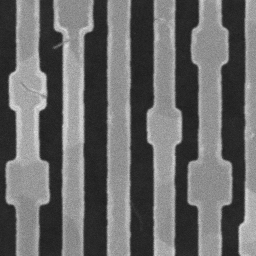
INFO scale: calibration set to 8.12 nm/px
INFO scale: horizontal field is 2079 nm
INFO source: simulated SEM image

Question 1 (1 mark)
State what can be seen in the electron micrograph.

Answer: wiring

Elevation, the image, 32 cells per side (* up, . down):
..*....*****..**...***.........*
..***.........**...***....**...*
..***.........**...***...***...*
..***.........**...***...***...*
..***..............***..****...*
..***...*..........***..****...*
..***...*.....**...***..****...*
..***...**....**...***..****...*
..***...**....**...***...***...*
.*****..**....**...***...***...*
.*****..**....**...***...***....
.*****..**....**...***...***...*
.*****..**....**...***...***...*
..***...**....**...***...***...*
..***...**....**...****..***...*
..***...**....**...****..***...*
..***...**....**...****..***...*
..***...**....**...***...***...*
..***...**....**...***...***...*
..***...**....**...***...***...*
.*****..**....**...***..*****..*
.*****..**....**...***..*****..*
.*****..**....**...***..*****..*
.*.***..**....**...***..*****..*
.*..**..**....**...***..*****..*
.****...**....**...***..****...*
..***...**....**...***...***...*
..***...**....**...***...***...*
..***...**....**...***...***..**
..***...**....**...***...***..**
..***...**....**...***...***..**
..***...**....**...***...***..**